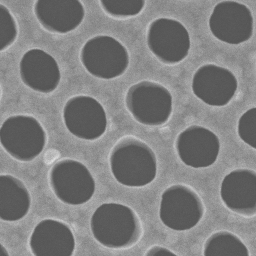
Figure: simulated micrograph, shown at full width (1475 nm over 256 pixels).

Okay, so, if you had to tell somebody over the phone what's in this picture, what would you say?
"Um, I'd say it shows a regular array of holes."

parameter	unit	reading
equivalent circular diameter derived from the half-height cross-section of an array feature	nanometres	249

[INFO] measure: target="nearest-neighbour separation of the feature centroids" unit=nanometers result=366